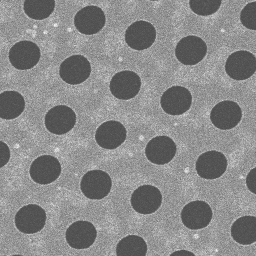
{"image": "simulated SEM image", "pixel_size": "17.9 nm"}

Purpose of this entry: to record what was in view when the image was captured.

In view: a regular array of holes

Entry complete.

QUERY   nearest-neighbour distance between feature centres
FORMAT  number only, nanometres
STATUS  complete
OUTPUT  930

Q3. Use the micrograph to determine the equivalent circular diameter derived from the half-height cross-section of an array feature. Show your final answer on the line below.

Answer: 551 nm